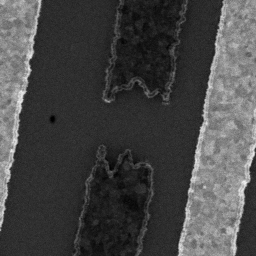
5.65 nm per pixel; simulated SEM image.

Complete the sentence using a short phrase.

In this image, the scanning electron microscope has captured one or a few lines or trenches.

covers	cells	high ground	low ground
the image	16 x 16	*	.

**.....*****..**
**.....****...**
**.....****...**
**.....****..***
**.....****..***
**.....*.**..***
*............***
*............***
*...........****
*...........****
*.....***...****
.....****...***.
.....****...***.
.....****...***.
.....****..****.
.....****..****.